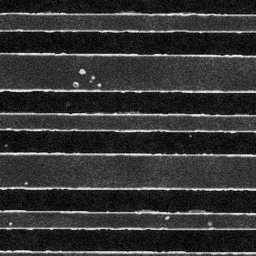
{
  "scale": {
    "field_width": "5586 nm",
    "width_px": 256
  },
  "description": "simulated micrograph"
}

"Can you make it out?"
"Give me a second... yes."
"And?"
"lines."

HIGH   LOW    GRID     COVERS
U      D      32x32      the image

DDDDDDDDDDDDDDDDDDDDDDDDDDDDDDDD
DDDDDDDDDDDDDDDDDDDDDDDDDDDDDDDD
UUUUUUUUUUUUUUUUUUUUUUUUUUUUUUUU
UUUUUUUUUUUUUUUUUUUUUUUUUUUUUUUU
DDDDDDDDDDDDDDDDDDDDDDDDDDDDDDDD
DDDDDDDDDDDDDDDDDDDDDDDDDDDDDDDD
DDDDDDDDDDDDDDDDDDDDDDDDDDDDDDDD
UUUUUUUUUUUUUUUUUUUUUUUUUUUUUUUU
UUUUUUUUUUUUUUUUUUUUUUUUUUUUUUUU
UUUUUUUUUUUUUUUUUUUUUUUUUUUUUUUU
UUUUUUUUUUUUUUUUUUUUUUUUUUUUUUUU
DDDDDDDDDDDDDDDDDUDDDDUUUUUUUUUU
DDDDDDDDDDDDDDDDDDDDDDDDDDDDDDDD
DDDDDDDDDDDDDDDDDDDDDDDDDDDDDDDD
UUUUUUUUUUUUUUUUUUUUUUUUUUUUUUUU
UUUUUUUUUUUUUUUUUUUUUUUUUUUUUUUU
DDDDDDDDDDDDDDDDDDDDDDDDDDDDUUDD
DDDDDDDDDDDDDDDDDDDDDDDDDDDDDDDD
DDDDDDDDDDDDDDDDDDDDDDDDDDDDDDDD
UUUUUUUUUUUUUUUUUUUUUUUUUUUUUUUU
UUUUUUUUUUUUUUUUUUUUUUUUUUUUUUUU
UUUUUUUUUUUUUUUUUUUUUUUUUUUUUUUU
UUUUUUUUUUUUUUUUUUUUUUUUUUUUUUUU
UUUUUUUUUUUUUUUUUUUUUUUUUUUUUUUU
DDDDDDDDDDDDDDDDDDDDDDDDDDDDDDDD
DDDDDDDDDDDDDDDDDDDDDDDDDDDDDDDD
UUUUUUUUUUUDDUDDDDDDDDDDDDDDDDDD
UUUUUUUUUUUUUUUUUUUUUUUUUUUUUUUU
UUUUUUUUUUUUUUUUUUUUUUUUUUUUUUUU
DDDDDDDDDDDDDDDDDDDDDDDDDDDDDDDD
DDDDDDDDDDDDDDDDDDDDDDDDDDDDDDDD
UUUUDDDDDDDDDDDDDDDDDDDDDDDDDDDD